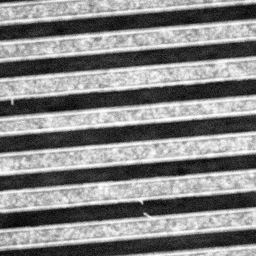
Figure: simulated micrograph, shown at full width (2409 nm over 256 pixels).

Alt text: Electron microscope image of parallel lines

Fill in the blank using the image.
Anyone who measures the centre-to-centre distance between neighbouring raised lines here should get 352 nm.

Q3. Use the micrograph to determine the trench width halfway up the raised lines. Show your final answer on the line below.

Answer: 21.4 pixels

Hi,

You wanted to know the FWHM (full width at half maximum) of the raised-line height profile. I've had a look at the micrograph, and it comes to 0.158 microns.